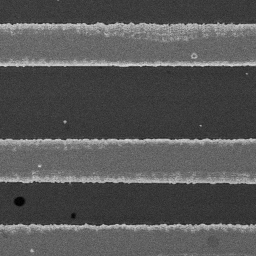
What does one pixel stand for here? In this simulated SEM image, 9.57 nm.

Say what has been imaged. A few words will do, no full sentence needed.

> lines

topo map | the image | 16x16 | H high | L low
LLLLLLLLLLLLLLLL
LLLLLLLLLLLLLLLL
HHHHHHHHHHHHHHHH
HHHHHHHHHHHHHHHH
LLLLLLLLLLLLLLLL
LLLLLLLLLLLLLLLL
LLLLLLLLLLLLLLLL
LLLLLLLLLLLLLLLL
LLLLLLLLLLLLLLLL
HHHHHHHHHHHHHHHH
HHHHHHHHHHHHHHHH
LLLLLLLLLLLLLLLL
LLLLLLLLLLLLLLLL
LLLLLLLLLLLLLLLL
HHHHHHHHHHHHHHHH
HHHHHHHHHHHHHHHH